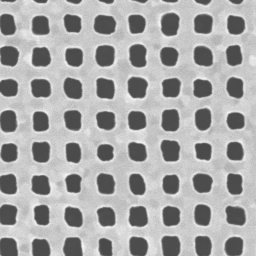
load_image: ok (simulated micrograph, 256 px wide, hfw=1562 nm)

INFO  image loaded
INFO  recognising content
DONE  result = a regular array of holes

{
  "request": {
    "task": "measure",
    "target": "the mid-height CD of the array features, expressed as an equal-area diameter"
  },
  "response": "0.118 microns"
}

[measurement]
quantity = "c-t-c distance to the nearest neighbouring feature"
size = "190 nm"